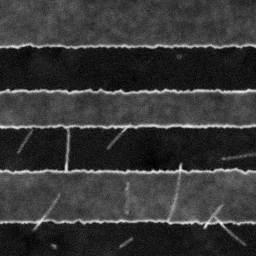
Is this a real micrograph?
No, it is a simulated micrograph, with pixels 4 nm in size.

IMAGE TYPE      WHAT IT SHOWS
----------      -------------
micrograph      lines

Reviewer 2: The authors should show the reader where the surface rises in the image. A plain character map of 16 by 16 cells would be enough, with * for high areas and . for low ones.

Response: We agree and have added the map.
****************
****************
****************
................
................
................
****************
****************
................
................
................
****************
****************
****************
................
................